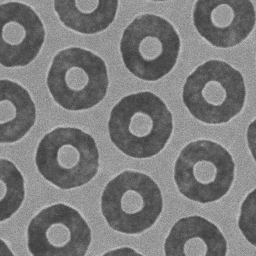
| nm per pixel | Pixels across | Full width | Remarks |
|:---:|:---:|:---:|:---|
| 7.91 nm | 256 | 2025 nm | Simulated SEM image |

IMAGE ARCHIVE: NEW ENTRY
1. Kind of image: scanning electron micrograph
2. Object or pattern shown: ring-shaped grooves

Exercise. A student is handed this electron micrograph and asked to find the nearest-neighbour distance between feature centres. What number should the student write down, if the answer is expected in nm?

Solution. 617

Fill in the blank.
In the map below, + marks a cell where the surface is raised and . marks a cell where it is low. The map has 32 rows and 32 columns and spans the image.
...++++..+++...+++++++++........
....+++...+....+++++++++...++...
.....+++......+++....+++..+++...
+++..++++....+++......++........
+++...+++++++++.......+++......+
.+...++++++++++...++...+++....++
.....++....++++...++..++++++++++
....+++......++.......++++.+++++
++++++...+...+++......+++....+++
++++++..+++..++++...++++......++
..++++..+++...+++++++++...+....+
...+++.......+++++.++++..+++...+
....+++......++.....+++...++...+
++..++++...+++.......++.......++
++..++++++++++...+...+++.....+++
....++++++++++..+++...+++++++++.
...+++.....+++..+++..++++++++++.
..+++.......++.......++++.+++++.
+++++...+...+++.....+++.....+++.
++++...+++..++++...+++.......+++
..+++..++...++++++++++...++..+++
..+++.......+++..+++++..+++..+++
...+++.....+++.....+++...++..+++
+..+++++.++++.......++.......+++
+..++++++++++..+++..+++.....+++.
...++++.+++++..+++..++++++++++..
..+++.....+++...+...++++++++++..
.+++.......++.......++....++++..
+++...++...+++.....+++.....+++..
+++...+++..++++++++++.......++..
.++....+...++++++++++..+++..+++.
.+++.......++....++++..+++..++++